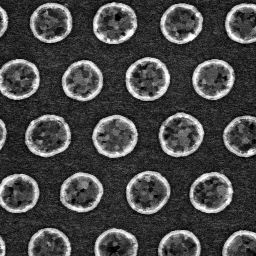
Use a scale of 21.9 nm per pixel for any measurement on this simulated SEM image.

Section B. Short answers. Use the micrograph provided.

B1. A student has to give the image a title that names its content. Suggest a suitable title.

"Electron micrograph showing a regular array of raised bodies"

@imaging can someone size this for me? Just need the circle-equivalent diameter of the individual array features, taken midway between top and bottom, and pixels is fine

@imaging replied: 39.3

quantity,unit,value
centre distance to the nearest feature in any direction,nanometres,1400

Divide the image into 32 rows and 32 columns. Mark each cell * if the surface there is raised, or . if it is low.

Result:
................................
.....***....*****....****....***
*...*****...*****...*****...****
*...*****...*****...*****...****
.....***....****.....***.....***
................................
................................
..................*.............
****.....***....*****....****...
*****...*****...*****...*****...
*****...*****...*****...*****...
****....****....****.....***....
................................
................................
......................*.........
....****....****.....****....***
*..******...*****...*****...****
...******...*****...*****...****
....****....****.....***.....***
................................
................................
................................
.***.....***.....***.....***....
*****...*****...*****...*****...
*****...*****...*****...*****...
****....****....****....****....
..................*.............
................................
................................
....****.....***.....***.....***
....*****...*****...*****...****
....*****...*****...*****...****